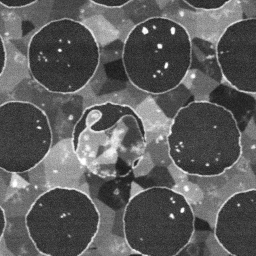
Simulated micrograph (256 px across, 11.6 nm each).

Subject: holes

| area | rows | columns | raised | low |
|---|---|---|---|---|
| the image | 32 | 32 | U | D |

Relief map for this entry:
DDDDUUUUUUUUDDDDUUUUUUUUDDDDUUUU
UUUUUUUUUUUUUUUUUUUUUUUUUUUUUUUU
UUUUUUUDDUUUUUUUUUDDDUUUUUUUUUUD
UUUUUDDDDDDUUUUUUDDDDDDUUUUUDDDD
UUUUDDDDDDDDUUUUDDDDDDDDUUUUDDDD
UUUUDDDDDDDDUUUUDDDDDDDDUUUDDDDD
DUUUDDDDDDDDUUUDDDDDDDDDUUUDDDDD
DUUUDDDDDDDDUUUDDDDDDDDDUUUDDDDD
UUUUDDDDDDDDUUUUDDDDDDDDUUUUDDDD
UUUUDDDDDDDDUUUUDDDDDDDUUUUUDDDD
UUUUUDDDDDDUUUUUUDDDDDUUUUUUUDDD
UUUUUUUDDUUUUUUUUUUDDUUUUUUUUUUD
UUUUUUUUUUUUUUUUUUUUUUUUUUUUUUUU
DDDDDUUUUUUDDDDDUUUUUUUDDDDDUUUU
DDDDDDUUUUDUUDDDUUUUUUDDDDDDDUUU
DDDDDDUUUUDUDDUUUDUUUUDDDDDDDDUU
DDDDDDUUUDUUUUUUUUUUUDDDDDDDDDUU
DDDDDDUUUDUUUUUUUUUUUDDDDDDDDDUU
DDDDDDUUUUUUUUUUUUUUUDDDDDDDDDUU
DDDDDDUUUUUUUUUUUUUUUDDDDDDDDDUU
DDDDDUUUUUUUUUUUUUUUUUDDDDDDDUUU
UDDUUUUUUUUUUUUUUUUUUUUDDDDDUUUU
UUUUUUUUUUUUUUUUUUUUUUUUUUUUUUUU
UUUUUUUDUUUUUUUUUUUDDUUUUUUUUUUU
UUUUUDDDDDDUUUUUUDDDDDDUUUUUUDDD
UUUUDDDDDDDDUUUUDDDDDDDDUUUUDDDD
UUUUDDDDDDDDUUUUDDDDDDDDUUUDDDDD
DUUDDDDDDDDDUUUUDDDDDDDDUUUDDDDD
DUUDDDDDDDDDUUUDDDDDDDDDUUUDDDDD
UUUUDDDDDDDDUUUUDDDDDDDDUUUDDDDD
UUUUDDDDDDDUUUUUDDDDDDDUUUUUDDDD
UUUUUDDDDDUUUUUUUDDDDDUUUUUUUDDD